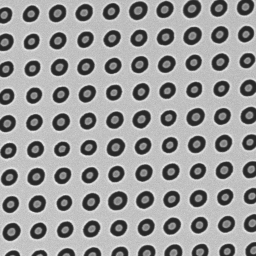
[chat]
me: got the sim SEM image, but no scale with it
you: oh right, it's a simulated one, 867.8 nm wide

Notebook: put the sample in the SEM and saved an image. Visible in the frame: a regular array of ring-shaped grooves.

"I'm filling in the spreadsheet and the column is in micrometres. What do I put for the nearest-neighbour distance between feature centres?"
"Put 0.0903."